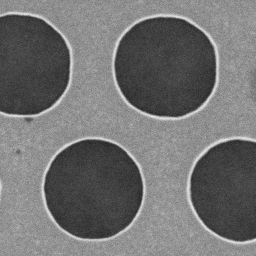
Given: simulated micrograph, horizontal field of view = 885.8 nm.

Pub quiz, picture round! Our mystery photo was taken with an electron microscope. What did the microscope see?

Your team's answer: holes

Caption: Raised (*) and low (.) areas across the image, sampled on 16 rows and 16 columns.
****************
...******...****
....****.....***
....***......***
....***.......**
....***......***
...*****.....***
****************
****************
****....*****...
***......***....
***......***....
***......***....
***.....****....
****....*****...
****************